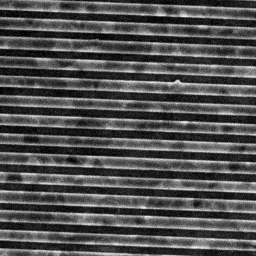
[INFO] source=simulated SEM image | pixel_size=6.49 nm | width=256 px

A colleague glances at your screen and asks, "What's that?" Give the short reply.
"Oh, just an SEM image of parallel lines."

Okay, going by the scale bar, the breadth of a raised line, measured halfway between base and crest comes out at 71.3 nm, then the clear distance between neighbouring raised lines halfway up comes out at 55.1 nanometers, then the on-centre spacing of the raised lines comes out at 125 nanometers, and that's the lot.